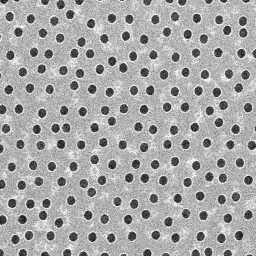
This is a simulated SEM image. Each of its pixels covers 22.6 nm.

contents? a regular array of holes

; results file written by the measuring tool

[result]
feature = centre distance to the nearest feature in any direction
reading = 388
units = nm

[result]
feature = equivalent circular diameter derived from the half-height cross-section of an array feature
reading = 224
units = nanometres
